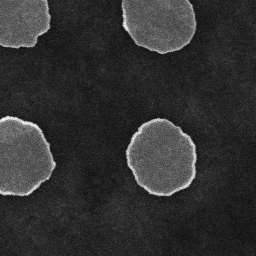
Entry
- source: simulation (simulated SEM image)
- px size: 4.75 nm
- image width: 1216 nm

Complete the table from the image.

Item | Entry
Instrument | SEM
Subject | raised bodies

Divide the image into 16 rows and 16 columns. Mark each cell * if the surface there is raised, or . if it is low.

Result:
***.....****....
***.....****....
**......****....
................
................
................
................
*...............
***.....****....
***.....****....
***.....****....
***......***....
................
................
................
................